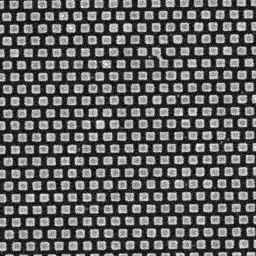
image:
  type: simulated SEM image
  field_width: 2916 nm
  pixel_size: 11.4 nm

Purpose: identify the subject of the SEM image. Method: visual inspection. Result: a regular array of raised bodies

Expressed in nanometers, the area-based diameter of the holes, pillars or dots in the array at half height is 101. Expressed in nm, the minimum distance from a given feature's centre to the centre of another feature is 157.